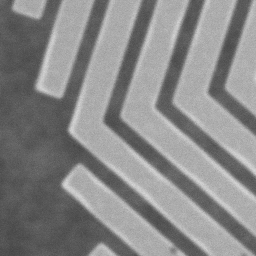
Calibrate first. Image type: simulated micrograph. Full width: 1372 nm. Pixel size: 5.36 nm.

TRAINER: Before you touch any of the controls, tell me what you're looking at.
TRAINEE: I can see groups of lines, slits or small figures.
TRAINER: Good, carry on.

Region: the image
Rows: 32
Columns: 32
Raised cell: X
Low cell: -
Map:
--XXXX--XXXX--XXX---XXX---XXX---
--XXX--XXXX--XXXX--XXXX--XXXX--X
-------XXXX--XXXX--XXXX--XXXX--X
-------XXXX--XXX---XXX---XXX---X
-------XXX--XXXX---XXX--XXXX--XX
------XXXX--XXXX--XXXX--XXXX--XX
------XXXX--XXXX--XXX---XXX--XXX
------XXX--XXXX--XXXX--XXXX--XXX
-----XXXX--XXXX--XXXX--XXXX--XXX
-----XXXX--XXXX--XXXX--XXXX--XXX
-----XXX---XXX--XXXX--XXXX--XXXX
------XX--XXXX--XXXX--XXXX---XXX
----------XXXX--XXXX--XXXXX---XX
----------XXX--XXXX---XXXXXX---X
---------XXXX--XXXXX----XXXXX---
---------XXXX---XXXXX----XXXXX--
---------XXXXX---XXXXX----XXXXX-
----------XXXXX---XXXXXX---XXXXX
-----------XXXXX----XXXXX---XXXX
------------XXXXX----XXXXX----XX
-------------XXXXX----XXXXX----X
---------XX----XXXX----XXXXX----
--------XXXX----XXXXX---XXXXX---
--------XXXXX----XXXXX----XXXX--
----------XXXXX---XXXXX----XXXXX
-----------XXXXX---XXXXX----XXXX
-----------XXXXXX---XXXXX----XXX
------------XXXXXX---XXXXXX---XX
--------------XXXXX---XXXXXX---X
---------------XXXXX----XXXXX---
----------------XXXXX----XXXXX--
------------XX---XXXXXX---XXXXX-